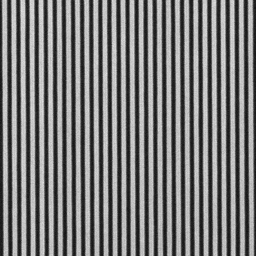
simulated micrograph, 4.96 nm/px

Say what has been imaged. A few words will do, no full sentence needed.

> parallel lines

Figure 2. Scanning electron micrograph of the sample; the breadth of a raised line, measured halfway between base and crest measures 0.0198 µm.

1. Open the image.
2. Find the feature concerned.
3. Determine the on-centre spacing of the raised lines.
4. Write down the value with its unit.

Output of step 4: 45.1 nm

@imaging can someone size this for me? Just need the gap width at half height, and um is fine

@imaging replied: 0.0248